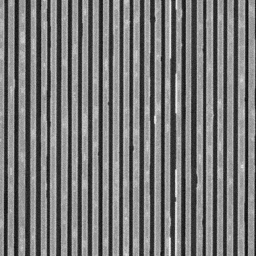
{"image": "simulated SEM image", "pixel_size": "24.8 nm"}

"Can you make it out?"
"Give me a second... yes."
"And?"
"parallel lines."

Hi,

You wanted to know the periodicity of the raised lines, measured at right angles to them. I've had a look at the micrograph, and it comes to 259 nanometers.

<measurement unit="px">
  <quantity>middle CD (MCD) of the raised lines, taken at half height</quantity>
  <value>4.63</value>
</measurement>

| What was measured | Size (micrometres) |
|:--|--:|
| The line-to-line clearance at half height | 0.137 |